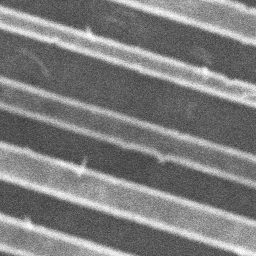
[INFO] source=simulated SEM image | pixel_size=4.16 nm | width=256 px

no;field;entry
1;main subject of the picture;one or a few lines or trenches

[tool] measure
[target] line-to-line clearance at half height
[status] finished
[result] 159 nm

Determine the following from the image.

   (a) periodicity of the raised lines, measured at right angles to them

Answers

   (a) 284 nanometres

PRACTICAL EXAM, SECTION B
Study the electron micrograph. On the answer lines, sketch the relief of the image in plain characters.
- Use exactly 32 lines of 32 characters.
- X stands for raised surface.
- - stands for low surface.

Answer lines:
----------------XXXXXXXXXXXXXX--
XX-----------------XXXXXXXXXXXXX
XXXXX------------------XXXXXXXXX
-XXXXXXX------------------XXXXXX
----XXXXXXXX-----------------XXX
-------XXXXXXXX-----------------
----------XXXXXXXX--------------
--------------XXXXXXX-----------
----------------XXXXXXXX--------
--------------------XXXXXXX-----
XX---------------------XXXXXXXX-
XXXXX---------------------XXXXXX
XXXXXXXXX--------------------XXX
-XXXXXXXXXXX--------------------
----XXXXXXXXXXX-----------------
-------XXXXXXXXXXX--------------
----------XXXXXXXXXXXX----------
--------------XXXXXXXXXXX-------
XX---------------XXXXXXXXXXX----
XXXXX---------------XXXXXXXXXXX-
XXXXXXXXX--------------XXXXXXXXX
XXXXXXXXXXXX--------------XXXXXX
-XXXXXXXXXXXXXX---------------XX
----XXXXXXXXXXXXXX--------------
--------XXXXXXXXXXXXX-----------
-----------XXXXXXXXXXXXX--------
--------------XXXXXXXXXXXXXX----
XX---------------XXXXXXXXXXXXXX-
XXXXX---------------XXXXXXXXXXXX
XXXXXXXX----------------XXXXXXXX
XXXXXXXXXXX----------------XXXXX
-XXXXXXXXXXXXX----------------XX